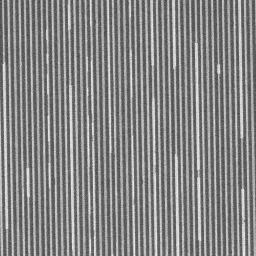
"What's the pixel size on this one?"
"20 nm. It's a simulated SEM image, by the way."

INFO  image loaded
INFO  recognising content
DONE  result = parallel lines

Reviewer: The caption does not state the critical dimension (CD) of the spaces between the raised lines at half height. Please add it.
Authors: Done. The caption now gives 75 nm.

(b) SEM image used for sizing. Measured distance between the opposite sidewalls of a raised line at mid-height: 37.5 nm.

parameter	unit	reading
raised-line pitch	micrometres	0.11